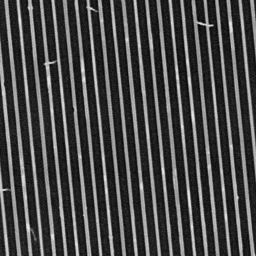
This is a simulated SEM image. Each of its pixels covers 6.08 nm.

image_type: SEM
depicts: parallel lines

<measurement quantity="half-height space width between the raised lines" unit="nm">52.9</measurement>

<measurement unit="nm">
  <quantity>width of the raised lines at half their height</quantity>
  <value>21.2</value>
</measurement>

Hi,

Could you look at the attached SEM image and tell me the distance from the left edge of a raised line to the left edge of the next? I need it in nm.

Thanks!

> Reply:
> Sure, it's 70.7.